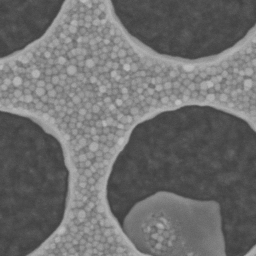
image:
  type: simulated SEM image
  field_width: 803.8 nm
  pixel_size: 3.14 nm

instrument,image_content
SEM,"holes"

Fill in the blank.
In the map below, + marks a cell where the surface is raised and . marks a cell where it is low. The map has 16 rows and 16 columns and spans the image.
....+++.........
...++++.........
..++++++.......+
.+++++++++...+++
++++++++++++++++
++++++++++++++++
++++++++++++++++
..+++++++......+
...+++++........
....++++........
....+++.........
....+++.........
....+++.........
....+++.........
...+++++........
..+++++++.......